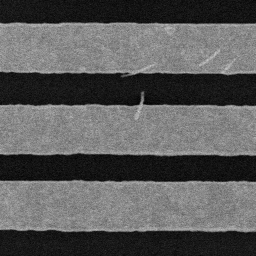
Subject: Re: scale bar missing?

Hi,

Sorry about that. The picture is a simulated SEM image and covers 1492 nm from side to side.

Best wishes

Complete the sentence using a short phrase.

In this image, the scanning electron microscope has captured lines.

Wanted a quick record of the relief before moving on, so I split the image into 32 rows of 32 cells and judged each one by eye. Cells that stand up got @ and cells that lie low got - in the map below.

--------------------------------
--------------------------------
--------------------------------
@@@@@@@@@@@@@@@@@@@@@@@@@@@@@@@@
@@@@@@@@@@@@@@@@@@@@@@@@@@@@@@@@
@@@@@@@@@@@@@@@@@@@@@@@@@@@@@@@@
@@@@@@@@@@@@@@@@@@@@@@@@@@@@@@@@
@@@@@@@@@@@@@@@@@@@@@@@@@@@@@@@@
@@@@@@@@@@@@@@@@@@@@@@@@@@@@@@@@
--------------------------------
--------------------------------
--------------------------------
--------------------------------
@@@@@@@@@@@@@@@@@@@@@@@@@@@@@@@@
@@@@@@@@@@@@@@@@@@@@@@@@@@@@@@@@
@@@@@@@@@@@@@@@@@@@@@@@@@@@@@@@@
@@@@@@@@@@@@@@@@@@@@@@@@@@@@@@@@
@@@@@@@@@@@@@@@@@@@@@@@@@@@@@@@@
@@@@@@@@@@@@@@@@@@@@@@@@@@@@@@@@
--------------------------------
--------------------------------
--------------------------------
--------------------------------
@@@@@@@@@@@@@@@@@@@@@@@@@@@@@@@@
@@@@@@@@@@@@@@@@@@@@@@@@@@@@@@@@
@@@@@@@@@@@@@@@@@@@@@@@@@@@@@@@@
@@@@@@@@@@@@@@@@@@@@@@@@@@@@@@@@
@@@@@@@@@@@@@@@@@@@@@@@@@@@@@@@@
@@@@@@@@@@@@@@@@@@@@@@@@@@@@@@@@
--------------------------------
--------------------------------
--------------------------------